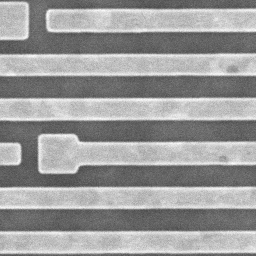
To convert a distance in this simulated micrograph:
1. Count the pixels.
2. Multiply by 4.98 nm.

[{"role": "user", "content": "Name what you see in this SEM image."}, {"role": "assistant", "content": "wiring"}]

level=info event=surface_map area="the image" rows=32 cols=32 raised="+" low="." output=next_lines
+++.............................
+++...++++++++++++++++++++++++++
+++...++++++++++++++++++++++++++
+++...++++++++++++++++++++++++++
+++.............................
................................
................................
++++++++++++++++++++++++++++++++
++++++++++++++++++++++++++++++++
................................
................................
................................
++++++++++++++++++++++++++++++++
++++++++++++++++++++++++++++++++
++++++++++++++++++++++++++++++++
................................
................................
.....+++++......................
+++..+++++++++++++++++++++++++++
+++..+++++++++++++++++++++++++++
++...+++++++++++++++++++++++++++
.....++++.......................
................................
.+++++++++++++++++++++++++++++++
++++++++++++++++++++++++++++++++
++++++++++++++++++++++++++++++++
................................
................................
................................
++++++++++++++++++++++++++++++++
++++++++++++++++++++++++++++++++
+++++++++++++...+++..++++.......